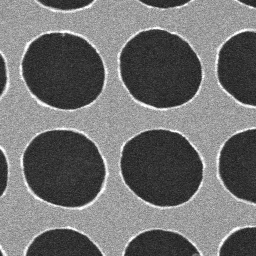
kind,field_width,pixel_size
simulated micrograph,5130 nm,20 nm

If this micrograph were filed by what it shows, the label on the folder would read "holes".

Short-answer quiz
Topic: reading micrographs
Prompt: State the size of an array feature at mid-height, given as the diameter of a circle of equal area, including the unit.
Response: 1620 nm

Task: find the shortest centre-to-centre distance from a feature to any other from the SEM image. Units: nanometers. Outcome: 1950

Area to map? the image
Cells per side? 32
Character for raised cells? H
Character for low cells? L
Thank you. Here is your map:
HHHHHLLLLLLHHHHHHHLLLLLHHHHHHHLL
HHHHHHHHHHHHHHHHHHHHHHHHHHHHHHHH
HHHHHHHHHHHHHHHHHHHHHHHHHHHHHHHH
HHHHHHHHHHHHHHHHHHHHHHHHHHHHHHHH
HHHHHLLLLLHHHHHHHLLLLLLHHHHHHLLL
HHHHLLLLLLLHHHHHLLLLLLLLHHHHLLLL
HHHLLLLLLLLLHHHLLLLLLLLLHHHLLLLL
LHHLLLLLLLLLLHHLLLLLLLLLLHHLLLLL
LHHLLLLLLLLLLHHLLLLLLLLLLHHLLLLL
LHHLLLLLLLLLLHHLLLLLLLLLLHHLLLLL
LHHLLLLLLLLLLHHHLLLLLLLLLHHLLLLL
HHHHLLLLLLLLLHHHLLLLLLLLLHHHLLLL
HHHHHLLLLLLLHHHHHLLLLLLLHHHHHHLL
HHHHHHHLLLHHHHHHHHHHLHHHHHHHHHHH
HHHHHHHHHHHHHHHHHHHHHHHHHHHHHHHH
HHHHHHHHHHHHHHHHHHHHHHHHHHHHHHHH
HHHHHLLLLLHHHHHHHHLLLLHHHHHHHHLL
HHHHLLLLLLLHHHHHLLLLLLLHHHHHLLLL
HHHLLLLLLLLLHHHLLLLLLLLLHHHHLLLL
LHHLLLLLLLLLLHHLLLLLLLLLLHHLLLLL
LHHLLLLLLLLLLHHLLLLLLLLLLHHLLLLL
LHHLLLLLLLLLLHHLLLLLLLLLLHHLLLLL
LHHLLLLLLLLLLHHHLLLLLLLLLHHHLLLL
LHHHLLLLLLLLLHHHLLLLLLLLLHHHLLLL
HHHHLLLLLLLLHHHHHLLLLLLLHHHHHLLL
HHHHHHLLLLLHHHHHHHHLLLLHHHHHHHHH
HHHHHHHHHHHHHHHHHHHHHHHHHHHHHHHH
HHHHHHHHHHHHHHHHHHHHHHHHHHHHHHHH
HHHHHHHHHHHHHHHHHHHHHHHHHHHHHHHL
HHHHHLLLLLLHHHHHHLLLLLLHHHHHLLLL
HHHHLLLLLLLLHHHHLLLLLLLLHHHHLLLL
HHHLLLLLLLLLLHHHLLLLLLLLLHHLLLLL